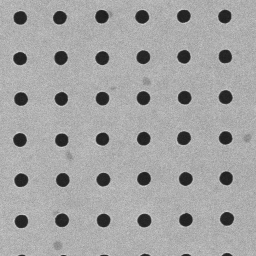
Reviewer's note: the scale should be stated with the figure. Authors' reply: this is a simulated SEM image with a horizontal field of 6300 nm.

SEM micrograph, a regular array of holes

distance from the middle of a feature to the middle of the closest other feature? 993 nanometers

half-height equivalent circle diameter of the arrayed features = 342 nm